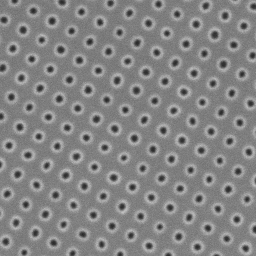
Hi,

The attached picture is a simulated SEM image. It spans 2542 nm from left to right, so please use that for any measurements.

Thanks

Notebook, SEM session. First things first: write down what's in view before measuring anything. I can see a regular array of holes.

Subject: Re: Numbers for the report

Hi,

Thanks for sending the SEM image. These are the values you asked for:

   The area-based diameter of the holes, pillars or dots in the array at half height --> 0.0768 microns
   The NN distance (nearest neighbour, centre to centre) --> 209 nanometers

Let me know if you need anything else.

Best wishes